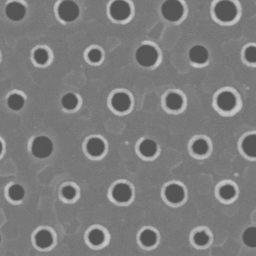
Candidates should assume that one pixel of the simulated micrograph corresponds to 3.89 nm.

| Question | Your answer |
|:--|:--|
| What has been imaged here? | a regular array of holes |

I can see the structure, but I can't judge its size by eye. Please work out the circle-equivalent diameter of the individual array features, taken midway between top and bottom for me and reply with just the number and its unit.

0.0679 micrometres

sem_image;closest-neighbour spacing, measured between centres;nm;202